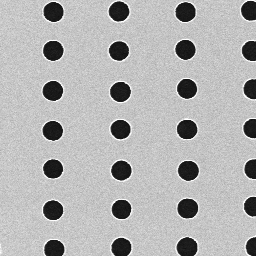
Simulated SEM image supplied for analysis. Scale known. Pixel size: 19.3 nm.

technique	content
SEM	a regular array of holes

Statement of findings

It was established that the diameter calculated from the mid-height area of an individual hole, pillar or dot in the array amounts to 394 nm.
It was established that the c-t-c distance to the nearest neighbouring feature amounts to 0.748 micrometres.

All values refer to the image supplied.